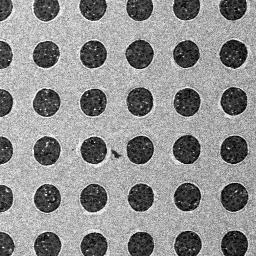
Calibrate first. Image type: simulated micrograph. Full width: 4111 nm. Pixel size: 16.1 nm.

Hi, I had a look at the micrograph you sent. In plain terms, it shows a regular array of holes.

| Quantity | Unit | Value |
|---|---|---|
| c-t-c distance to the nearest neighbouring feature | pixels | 46.6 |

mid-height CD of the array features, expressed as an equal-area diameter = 25.7 px